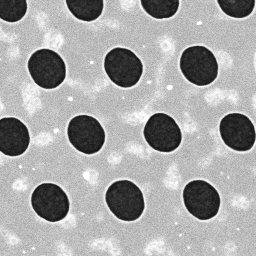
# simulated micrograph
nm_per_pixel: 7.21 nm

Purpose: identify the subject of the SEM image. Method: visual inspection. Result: a regular array of holes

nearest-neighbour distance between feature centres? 548 nm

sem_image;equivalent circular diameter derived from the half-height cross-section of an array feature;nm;280